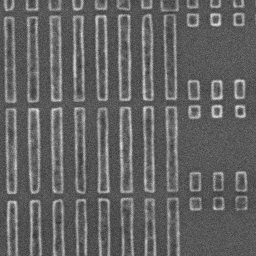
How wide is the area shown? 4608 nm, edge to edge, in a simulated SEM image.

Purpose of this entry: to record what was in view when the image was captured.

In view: wiring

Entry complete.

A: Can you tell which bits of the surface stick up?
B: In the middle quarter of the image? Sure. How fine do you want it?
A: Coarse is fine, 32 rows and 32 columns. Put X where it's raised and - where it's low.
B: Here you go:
---XX---XXX---XX----XX---XXX----
---XX----XX---XX----XX---XXX----
---XX----XX---XX----XX----XX----
---XX----XX---XX----XX----XX----
---XX----XX---XX----XX----XX---X
---XX----XX---XX----XX----XX---X
---XX----XX---XX----XX----XX---X
---XX----XX---XX----XX----XX---X
---XX----XX---XX----XX----XX----
--------------------------------
--------------------------------
---XX----X----XX----XX----XX----
---XX----X----XX----XX----XX----
---XX----XX---XX----XX----XX----
---XX----XX---XX----XX----XX----
---XX----XX---XX----XX----XX----
---XX----XX---XXX---XX----XX----
---XX----XX---XXX---XX----XX----
---XX----XX---XXX---XX----XX----
---XX----XX---XXX---XX----XX----
---XX----XX---XXX---XX----XX----
---XX----XX---XXX---XX----XX----
---XX----XX---XXX---XX----XX----
---XX----XX---XXX---XX----XX----
---XX----XX---XXX---XX----XX----
---XX----XX---XXX---XX----XX----
---XX----XX----XX---XX----XX----
---XX----XX----XX---XX----XX----
---XX----XX----XX---XX----XX----
---XX----XX---XXX---XX----XX----
---XX----XX---XXX---XX----XX----
---XX----XX---XXX----X----------